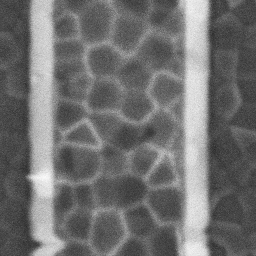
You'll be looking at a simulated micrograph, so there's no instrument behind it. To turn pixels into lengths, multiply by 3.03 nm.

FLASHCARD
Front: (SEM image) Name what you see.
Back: one or a few lines or trenches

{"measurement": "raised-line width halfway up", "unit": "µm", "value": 0.462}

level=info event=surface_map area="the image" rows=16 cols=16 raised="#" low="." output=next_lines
...#########....
...#########....
...#########....
...#########....
...#########....
...#########....
...#########....
...#########....
...#########....
...#########....
...#########....
...#########....
...#########....
...#########....
...#########....
...#########....